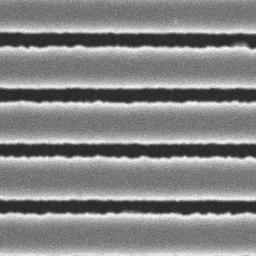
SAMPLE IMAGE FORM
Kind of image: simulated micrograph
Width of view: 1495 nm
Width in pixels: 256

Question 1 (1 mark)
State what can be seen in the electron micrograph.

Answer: lines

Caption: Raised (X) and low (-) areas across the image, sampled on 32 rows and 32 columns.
XXXXXXXXXXXXXXXXXXXXXXXXXXXXXXXX
XXXXXXXXXXXXXXXXXXXXXXXXXXXXXXXX
XXXXXXXXXXXXXXXXXXXXXXXXXXXXXXXX
XXXXXXXXXXXXXXXXXXXXXXXXXXXXXXXX
--------------------------------
--------------------------------
XXXXXXXXXXXXXXXXXXXXXXXXXXXXXXXX
XXXXXXXXXXXXXXXXXXXXXXXXXXXXXXXX
XXXXXXXXXXXXXXXXXXXXXXXXXXXXXXXX
XXXXXXXXXXXXXXXXXXXXXXXXXXXXXXXX
XXXXXXXXXXXXXXXXXXXXXXXXXXXXXXXX
--------------------------------
--------------------------------
XXXXXXXXXXXXXXXXXXXXXXXXXXXXXXXX
XXXXXXXXXXXXXXXXXXXXXXXXXXXXXXXX
XXXXXXXXXXXXXXXXXXXXXXXXXXXXXXXX
XXXXXXXXXXXXXXXXXXXXXXXXXXXXXXXX
XXXXXXXXXXXXXXXXXXXXXXXXXXXXXXXX
--------------------------------
--------------------------------
XXXXXXXXXXXXXXXXXXXXXXXXXXXXXXXX
XXXXXXXXXXXXXXXXXXXXXXXXXXXXXXXX
XXXXXXXXXXXXXXXXXXXXXXXXXXXXXXXX
XXXXXXXXXXXXXXXXXXXXXXXXXXXXXXXX
XXXXXXXXXXXXXXXXXXXXXXXXXXXXXXXX
--------------------------------
--------------------------------
XXXXXXXXXXXXXXXXXXXXXXXXXXXXXXXX
XXXXXXXXXXXXXXXXXXXXXXXXXXXXXXXX
XXXXXXXXXXXXXXXXXXXXXXXXXXXXXXXX
XXXXXXXXXXXXXXXXXXXXXXXXXXXXXXXX
XXXXXXXXXXXXXXXXXXXXXXXXXXXXXXXX